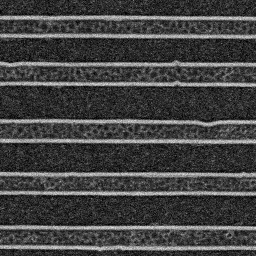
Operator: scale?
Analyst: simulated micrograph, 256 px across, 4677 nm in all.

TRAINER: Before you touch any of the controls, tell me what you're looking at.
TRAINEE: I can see parallel lines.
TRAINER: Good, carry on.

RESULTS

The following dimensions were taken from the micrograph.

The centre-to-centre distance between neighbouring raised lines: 962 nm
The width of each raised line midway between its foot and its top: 19.1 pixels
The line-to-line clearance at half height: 628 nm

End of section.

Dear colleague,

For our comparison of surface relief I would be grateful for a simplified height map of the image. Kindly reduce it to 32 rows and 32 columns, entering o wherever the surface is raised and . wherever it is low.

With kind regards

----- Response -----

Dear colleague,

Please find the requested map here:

................................
................................
oooooooooooooooooooooooooooooooo
oooooooooooooooooooooooooooooooo
...............o.oooooo.oooooooo
................................
................................
................................
oooooooooooooooooooooooooooooooo
oooooooooooooooooooooooooooooooo
................oooooooooooooooo
................................
................................
................................
................................
oooooooooooooooooooooooooooooooo
oooooooooooooooooooooooooooooooo
oooooooooooooooooooooooooooooooo
................................
................................
................................
................................
oooooooooooooooooooooooooooooooo
oooooooooooooooooooooooooooooooo
................................
................................
................................
................................
oooooooo............ooooooo.....
oooooooooooooooooooooooooooooooo
oooooooooooooooooooooooooooooooo
................................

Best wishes